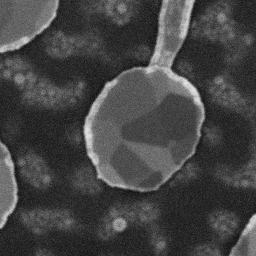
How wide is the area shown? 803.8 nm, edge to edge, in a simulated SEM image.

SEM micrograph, raised bodies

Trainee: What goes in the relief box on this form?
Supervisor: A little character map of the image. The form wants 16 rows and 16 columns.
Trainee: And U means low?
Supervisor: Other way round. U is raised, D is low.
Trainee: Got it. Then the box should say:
UUUUDDDDDDUUDDDD
UUUDDDDDDDUUDDDD
UUDDDDDDDDUDDDDD
DDDDDDDDDDUDDDDD
DDDDDDDDUUUDDDDD
DDDDDDDUUUUUDDDD
DDDDDDUUUUUUUDDD
DDDDDUUUUUUUUDDD
DDDDDUUUUUUUDDDD
UDDDDDUUUUUUDDDD
UDDDDDUUUUUDDDDD
UDDDDDDUUUDDDDDD
UDDDDDDDDDDDDDDD
UDDDDDDDDDDDDDDD
DDDDDDDDDDDDDDDU
DDDDDDDDDDDDDDDU